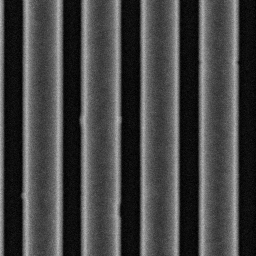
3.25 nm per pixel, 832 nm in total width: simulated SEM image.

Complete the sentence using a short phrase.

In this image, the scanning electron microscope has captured parallel lines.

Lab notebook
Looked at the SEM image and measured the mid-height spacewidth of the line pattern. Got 70.4 nm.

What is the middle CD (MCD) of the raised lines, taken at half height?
0.12 microns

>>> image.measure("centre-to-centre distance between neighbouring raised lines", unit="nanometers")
191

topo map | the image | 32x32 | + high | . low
...+++++..+++++...++++...+++++..
...+++++..+++++...++++...+++++..
...+++++..+++++...++++...+++++..
...+++++..+++++...++++...+++++..
...+++++..+++++...++++...+++++..
...+++++..+++++...++++...+++++..
...+++++..+++++...++++...+++++..
...+++++..+++++...++++...+++++..
...+++++..+++++...++++...+++++..
...+++++..+++++...++++...+++++..
...+++++..+++++...++++...+++++..
...+++++..+++++...++++...+++++..
...+++++..+++++...++++...+++++..
...+++++..+++++...++++...+++++..
...+++++..+++++...++++...+++++..
...+++++..+++++...++++...+++++..
...+++++..+++++...++++...+++++..
...+++++..+++++...++++...+++++..
...+++++..+++++...++++...+++++..
...+++++..+++++...++++...+++++..
...+++++..+++++...++++...+++++..
...+++++..+++++...++++...+++++..
...+++++..+++++...++++...+++++..
...+++++..+++++...++++...+++++..
...+++++..+++++...++++...+++++..
...+++++..+++++...++++...+++++..
...+++++..+++++...++++...+++++..
...+++++..+++++...++++...+++++..
...+++++..+++++...++++...+++++..
...+++++..+++++...++++...+++++..
...+++++..+++++...++++...+++++..
...+++++..+++++...++++...+++++..